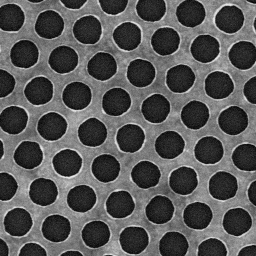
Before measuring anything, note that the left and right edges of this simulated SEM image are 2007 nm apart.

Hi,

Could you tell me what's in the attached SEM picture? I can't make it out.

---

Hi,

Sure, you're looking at a regular array of holes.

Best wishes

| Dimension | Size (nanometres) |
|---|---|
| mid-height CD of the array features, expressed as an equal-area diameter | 230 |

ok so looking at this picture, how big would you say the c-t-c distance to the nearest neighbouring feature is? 299 nm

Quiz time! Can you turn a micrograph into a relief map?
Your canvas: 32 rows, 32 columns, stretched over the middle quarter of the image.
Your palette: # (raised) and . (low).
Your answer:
...###.......###......######...#
..####.......###.......###......
######.......###.......##.......
#######.....####.......##.......
##..############......###.......
......###########....#####......
.......####....###########.....#
.......###......######..########
.......###.......####....#######
.......##........###......#####.
#.....####.......##........###..
##..######......###........##...
###########....#####......###...
######..############......###...
.####.....###########....#####..
.###......#####....###########..
.##........##.......############
###........##.......####.....###
####.......##.......###.......##
####......###.......###.......##
######...####.......###.......##
...###########.....####.......##
....###################......###
....####.....############...####
.....##.......#####...##########
....###.......####.....#######.#
....###.......###.......###.....
...####.......###.......###.....
########.....####.......##......
##########.######.......##......
###...############.....###......
#.......######.############.....